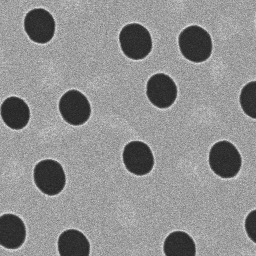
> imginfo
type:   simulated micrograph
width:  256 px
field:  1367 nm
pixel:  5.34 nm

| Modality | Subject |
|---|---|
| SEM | a regular array of holes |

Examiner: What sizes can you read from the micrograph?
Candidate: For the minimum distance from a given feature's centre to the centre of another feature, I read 318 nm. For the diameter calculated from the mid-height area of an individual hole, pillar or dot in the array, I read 174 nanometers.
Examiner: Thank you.